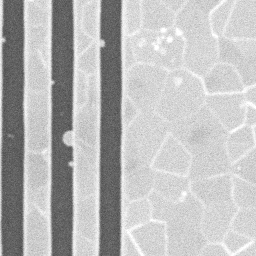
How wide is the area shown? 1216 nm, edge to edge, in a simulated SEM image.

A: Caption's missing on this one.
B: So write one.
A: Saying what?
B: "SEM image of wiring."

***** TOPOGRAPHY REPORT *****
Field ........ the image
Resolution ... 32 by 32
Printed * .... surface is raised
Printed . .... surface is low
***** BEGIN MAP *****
...***...***...*****************
...***...***...*****************
...***...***...*****************
...***...***...*****************
...***...***...*****************
...***...***...*****************
...***...***...*****************
...***...***...*****************
...***...***...*****************
...***...***...*****************
...***...***...*****************
...***...***...*****************
...***...***...*****************
...***...***...*****************
...***...***...*****************
...***...***...*****************
...***...***...*****************
...***...***...*****************
...***...***...*****************
...***...***...*****************
...***...***...*****************
...***...***...*****************
...***...***...*****************
...***...***...*****************
...***...***...*****************
...***...***...*****************
...***...***...*****************
...***...***...*****************
...***...***...*****************
...***...***...*****************
...***...***...*****************
...***...***...*****************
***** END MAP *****